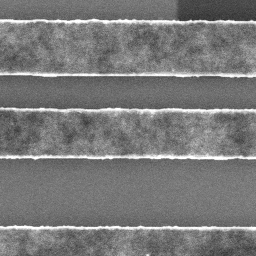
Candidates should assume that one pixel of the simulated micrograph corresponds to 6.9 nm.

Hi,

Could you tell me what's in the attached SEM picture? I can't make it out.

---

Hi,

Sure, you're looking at lines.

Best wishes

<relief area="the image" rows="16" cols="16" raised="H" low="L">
LLLLLLLLLLLLLLLL
HHHHHHHHHHHHHHHH
HHHHHHHHHHHHHHHH
HHHHHHHHHHHHHHHH
HHHHHHHHHHHHHHHH
LLLLLLLLLLLLLLLL
LLLLLLLLLLLLLLLL
HHHHHHHHHHHHHHHH
HHHHHHHHHHHHHHHH
HHHHHHHHHHHHHHHH
LLLLLLLLLLLLLLLL
LLLLLLLLLLLLLLLL
LLLLLLLLLLLLLLLL
LLLLLLLLLLLLLLLL
HHHHHHHHHHHHHHHH
HHHHHHHHHHHHHHHH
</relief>